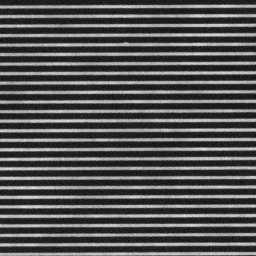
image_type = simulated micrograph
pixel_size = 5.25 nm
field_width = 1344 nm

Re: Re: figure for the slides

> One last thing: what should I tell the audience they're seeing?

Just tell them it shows parallel lines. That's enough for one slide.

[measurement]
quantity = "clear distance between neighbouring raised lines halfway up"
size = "0.0334 micrometres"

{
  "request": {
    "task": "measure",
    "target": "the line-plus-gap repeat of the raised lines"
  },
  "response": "49.9 nanometres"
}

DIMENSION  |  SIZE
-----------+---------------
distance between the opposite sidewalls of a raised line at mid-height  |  2.74 pixels